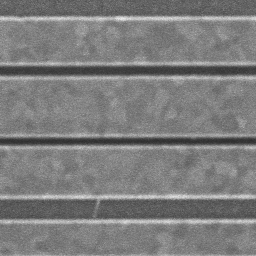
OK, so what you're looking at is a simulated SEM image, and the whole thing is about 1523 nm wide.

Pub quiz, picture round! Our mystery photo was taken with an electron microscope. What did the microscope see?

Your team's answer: one or a few lines or trenches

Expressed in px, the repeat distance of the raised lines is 65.